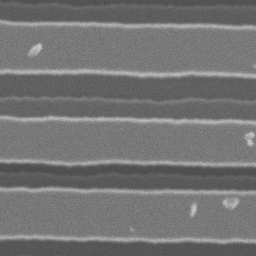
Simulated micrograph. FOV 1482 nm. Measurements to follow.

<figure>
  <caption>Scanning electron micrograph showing lines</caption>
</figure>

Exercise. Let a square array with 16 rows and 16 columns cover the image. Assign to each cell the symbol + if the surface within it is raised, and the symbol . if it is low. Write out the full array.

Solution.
................
+++++++.........
++++++++++++++++
++++++++++++++++
++++++++++++++++
................
................
+++++++++++.....
++++++++++++++++
++++++++++++++++
................
................
++++++++++++++++
++++++++++++++++
++++++++++++++++
................